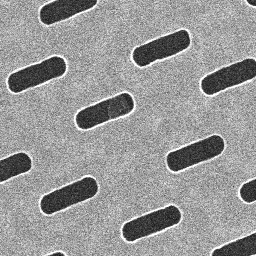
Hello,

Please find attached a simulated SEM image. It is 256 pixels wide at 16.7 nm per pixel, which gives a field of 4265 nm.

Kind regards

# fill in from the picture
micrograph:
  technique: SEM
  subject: holes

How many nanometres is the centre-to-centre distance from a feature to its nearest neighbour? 1380